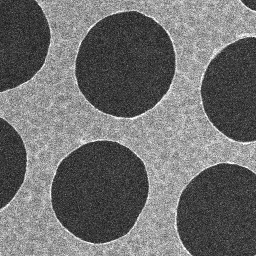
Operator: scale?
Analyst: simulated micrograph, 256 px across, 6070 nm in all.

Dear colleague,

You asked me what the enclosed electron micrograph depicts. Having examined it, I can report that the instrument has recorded holes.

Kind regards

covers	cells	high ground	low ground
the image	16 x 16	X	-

---XXXXXXXXXXXXX
---XXX----XXXXXX
---XX------XXXX-
---XX------XX---
--XXX------XX---
-XXXX------XX---
XXXXXX----XXX---
XXXXXXXXXXXXX---
-XXXXXXXXXXXXX--
--XXX---XXXXXXXX
--XX-----XXXX--X
-XX------XXX----
-XX------XX-----
XXXX-----XX-----
XXXX----XXX-----
XXXXXXXXXXXX----